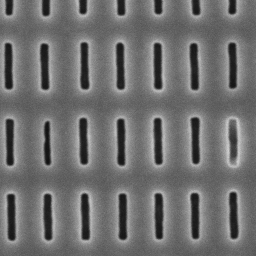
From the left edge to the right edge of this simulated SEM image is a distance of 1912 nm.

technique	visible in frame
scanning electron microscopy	a regular array of holes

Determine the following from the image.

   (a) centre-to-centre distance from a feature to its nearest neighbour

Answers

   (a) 0.272 µm